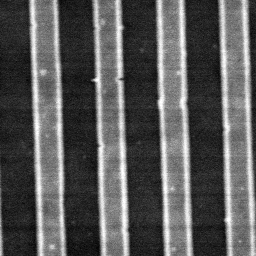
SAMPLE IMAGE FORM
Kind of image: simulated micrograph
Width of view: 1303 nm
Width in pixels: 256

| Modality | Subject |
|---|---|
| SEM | one or a few lines or trenches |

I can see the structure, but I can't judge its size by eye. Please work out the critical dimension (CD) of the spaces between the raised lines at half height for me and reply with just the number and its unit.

0.193 microns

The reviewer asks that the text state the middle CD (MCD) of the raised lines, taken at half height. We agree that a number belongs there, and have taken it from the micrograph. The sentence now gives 25.2 pixels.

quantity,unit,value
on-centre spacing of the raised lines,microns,0.321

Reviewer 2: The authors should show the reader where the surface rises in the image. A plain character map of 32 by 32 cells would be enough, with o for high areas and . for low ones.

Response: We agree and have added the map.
....ooo.....ooo.....ooo.....ooo.
....ooo.....ooo.....ooo.....ooo.
....ooo.....ooo.....ooo.....ooo.
....ooo.....ooo.....ooo.....ooo.
....ooo.....ooo.....ooo.....ooo.
....ooo.....ooo.....ooo.....ooo.
....ooo.....ooo.....ooo.....ooo.
....ooo.....ooo.....ooo.....ooo.
....ooo.....ooo.....ooo.....ooo.
....ooo.....ooo.....ooo.....ooo.
....ooo.....ooo.....ooo.....ooo.
....ooo.....ooo.....ooo.....ooo.
....oooo....ooo.....ooo.....ooo.
....oooo....ooo.....ooo.....ooo.
....oooo....ooo.....ooo.....ooo.
....oooo....ooo.....ooo.....ooo.
....oooo....ooo.....ooo.....ooo.
.....ooo....ooo.....ooo.....ooo.
.....ooo....ooo.....ooo.....ooo.
.....ooo....ooo.....ooo.....ooo.
.....ooo....ooo.....ooo.....ooo.
.....ooo....oooo....ooo.....ooo.
.....ooo....oooo....oooo....ooo.
.....ooo.....ooo.....ooo....ooo.
.....ooo.....ooo.....ooo....oooo
.....ooo.....ooo.....ooo....oooo
.....ooo.....ooo.....ooo....oooo
.....ooo.....ooo.....ooo....oooo
.....ooo.....ooo.....ooo....oooo
.....ooo.....ooo.....ooo....oooo
.....ooo.....ooo.....ooo.....ooo
.....ooo.....ooo.....ooo.....ooo